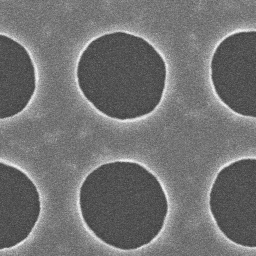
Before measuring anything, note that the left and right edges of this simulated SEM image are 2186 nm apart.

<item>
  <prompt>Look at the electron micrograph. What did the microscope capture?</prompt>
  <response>holes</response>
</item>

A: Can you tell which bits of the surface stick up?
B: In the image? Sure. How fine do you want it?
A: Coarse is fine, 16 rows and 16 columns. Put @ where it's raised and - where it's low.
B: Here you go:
@@@@@@@@@@@@@@@@
@@@@@@@@@@@@@@@@
-@@@@@---@@@@@--
--@@@-----@@@---
--@@@-----@@@---
--@@@-----@@@---
--@@@@----@@@@--
@@@@@@@-@@@@@@@@
@@@@@@@@@@@@@@@@
@@@@@@@@@@@@@@@@
-@@@@@---@@@@@--
--@@@-----@@@---
--@@@-----@@@---
--@@@-----@@@---
--@@@@----@@@@--
@@@@@@@--@@@@@@@